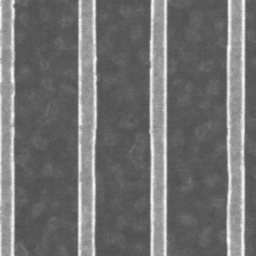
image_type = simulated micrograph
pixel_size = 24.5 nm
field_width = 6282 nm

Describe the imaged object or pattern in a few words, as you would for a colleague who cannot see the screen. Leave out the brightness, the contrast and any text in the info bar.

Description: one or a few lines or trenches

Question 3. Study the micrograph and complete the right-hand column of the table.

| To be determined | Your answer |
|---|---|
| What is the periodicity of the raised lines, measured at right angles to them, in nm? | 1830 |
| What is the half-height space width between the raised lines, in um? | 1.55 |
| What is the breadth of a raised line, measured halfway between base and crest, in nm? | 340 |